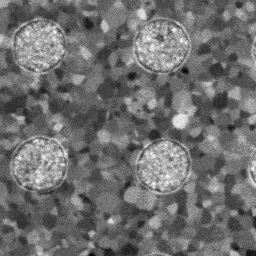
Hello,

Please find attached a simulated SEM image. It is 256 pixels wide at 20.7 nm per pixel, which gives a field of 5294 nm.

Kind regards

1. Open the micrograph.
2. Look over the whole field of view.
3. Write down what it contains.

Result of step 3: holes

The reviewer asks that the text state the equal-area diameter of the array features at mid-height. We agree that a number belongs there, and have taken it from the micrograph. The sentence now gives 1110 nm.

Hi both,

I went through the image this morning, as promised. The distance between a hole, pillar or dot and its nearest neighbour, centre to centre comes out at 2.47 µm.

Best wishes